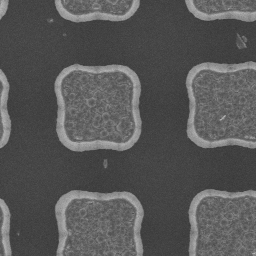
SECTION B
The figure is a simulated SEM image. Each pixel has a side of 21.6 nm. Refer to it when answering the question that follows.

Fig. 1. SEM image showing raised bodies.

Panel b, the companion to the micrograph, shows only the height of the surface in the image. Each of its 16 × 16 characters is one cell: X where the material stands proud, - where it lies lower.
----XXXX----XXXX
----------------
----------------
----------------
----XXXX----XXXX
----XXXXX---XXXX
----XXXX----XXXX
----XXXXX---XXXX
----XXXX----XXXX
----------------
----------------
----------------
----XXXX----XXXX
----XXXXX---XXXX
----XXXXX---XXXX
----XXXXX---XXXX